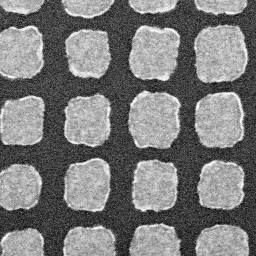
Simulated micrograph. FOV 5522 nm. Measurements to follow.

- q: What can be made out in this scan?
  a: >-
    a regular array of raised bodies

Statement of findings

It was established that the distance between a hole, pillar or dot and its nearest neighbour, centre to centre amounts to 1400 nm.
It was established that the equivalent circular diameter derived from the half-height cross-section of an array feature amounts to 1.08 microns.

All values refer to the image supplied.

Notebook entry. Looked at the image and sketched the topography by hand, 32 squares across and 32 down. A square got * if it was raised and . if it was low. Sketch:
*****...******..******..*******.
..**.....****.....**......****..
................................
...*..............*.......****..
*****....****....*****...*****..
*****...*****....*****..*****.*.
*****...******..******..*******.
*****....*****..******...******.
*****....****...******...******.
.***......***....****....*****..
................................
................................
...**....****....*****...*****..
*****...*****...******...*****..
*****...*****...******..******..
*****...******..******..******..
*****...***.**..******...*****..
*****....****....*****...*****..
....................*...........
................................
..........***....****.....***...
*****...******...*****...*****..
*****...******...*****...*****..
*****...******...*****...*****..
*****...*****....*****...*****..
****....*****....*****...*****..
................................
................................
............*....****.....****..
.****...******...*****...******.
*****...******..******...******.
*****...******..******...******.